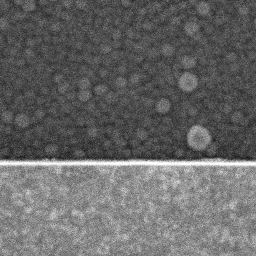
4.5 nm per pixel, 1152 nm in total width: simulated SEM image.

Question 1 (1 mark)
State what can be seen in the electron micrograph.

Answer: one or a few lines or trenches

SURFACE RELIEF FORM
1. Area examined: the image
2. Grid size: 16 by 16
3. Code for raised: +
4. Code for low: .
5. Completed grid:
................
................
................
................
................
................
................
................
................
................
++++++++++++++++
++++++++++++++++
++++++++++++++++
++++++++++++++++
++++++++++++++++
++++++++++++++++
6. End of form